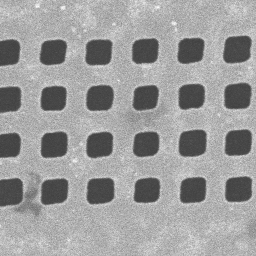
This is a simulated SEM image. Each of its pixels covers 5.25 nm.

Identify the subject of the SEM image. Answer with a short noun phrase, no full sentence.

a regular array of holes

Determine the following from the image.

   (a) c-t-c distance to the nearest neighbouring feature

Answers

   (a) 240 nanometres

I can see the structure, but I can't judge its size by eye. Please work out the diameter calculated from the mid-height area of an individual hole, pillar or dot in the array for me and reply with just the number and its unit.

144 nm